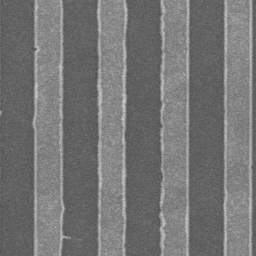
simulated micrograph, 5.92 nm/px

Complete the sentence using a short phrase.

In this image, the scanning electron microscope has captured one or a few lines or trenches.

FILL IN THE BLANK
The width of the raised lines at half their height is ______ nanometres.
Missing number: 148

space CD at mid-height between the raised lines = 227 nm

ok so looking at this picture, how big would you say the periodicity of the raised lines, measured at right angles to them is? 374 nm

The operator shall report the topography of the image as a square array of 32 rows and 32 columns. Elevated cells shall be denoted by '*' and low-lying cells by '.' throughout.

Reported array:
.....***....****....***.....***.
.....***....****....***.....***.
.....***....****....***.....***.
.....***....****....***.....***.
.....***....****....***.....***.
.....***....***.....***.....***.
.....***....****....***.....***.
.....***.....***....***.....***.
.....***....****....***.....***.
.....***....****....***.....***.
.....***....****....***.....***.
.....***....****....***.....***.
.....***.....***....***.....***.
.....***.....***....***.....***.
....****....****....***.....***.
....****....****....***.....***.
....****....***.....***.....***.
.....***....***.....***.....***.
.....***....***.....***.....***.
.....***....***.....***.....***.
.....***....****....***.....***.
.....***....***.....***.....***.
.....***....***.....***.....***.
.....***....****....***.....***.
.....***....****....***.....***.
.....***....****....***.....***.
.....***....****....***.....***.
.....***....****....***.....***.
.....***....****....***.....***.
.....***....***.....***.....***.
....****.....**.....***.....***.
....***.....***.....***.....***.